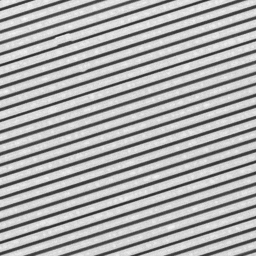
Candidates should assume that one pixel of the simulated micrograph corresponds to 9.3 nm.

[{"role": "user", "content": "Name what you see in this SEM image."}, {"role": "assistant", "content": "parallel lines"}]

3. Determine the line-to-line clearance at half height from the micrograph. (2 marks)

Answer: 34.4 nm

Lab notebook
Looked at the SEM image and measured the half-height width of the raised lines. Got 69.8 nanometers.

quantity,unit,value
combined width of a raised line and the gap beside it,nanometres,98.3